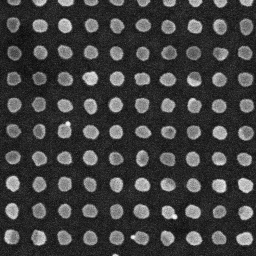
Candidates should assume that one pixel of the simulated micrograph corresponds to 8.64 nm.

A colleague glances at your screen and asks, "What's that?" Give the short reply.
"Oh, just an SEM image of a regular array of raised bodies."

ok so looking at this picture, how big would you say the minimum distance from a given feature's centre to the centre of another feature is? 218 nm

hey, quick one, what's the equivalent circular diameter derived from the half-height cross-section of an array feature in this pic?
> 117 nm